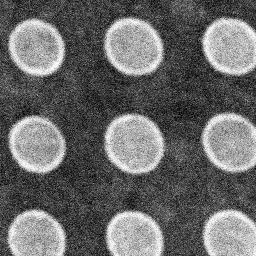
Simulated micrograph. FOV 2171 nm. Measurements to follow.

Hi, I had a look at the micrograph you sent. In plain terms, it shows raised bodies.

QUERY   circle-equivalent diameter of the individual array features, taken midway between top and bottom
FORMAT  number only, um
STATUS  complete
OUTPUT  0.454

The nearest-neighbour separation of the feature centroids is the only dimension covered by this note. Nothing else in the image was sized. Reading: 823 nanometres